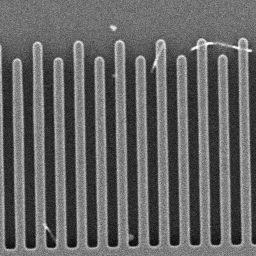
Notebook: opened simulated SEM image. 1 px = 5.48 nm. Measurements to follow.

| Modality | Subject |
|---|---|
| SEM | groups of lines, slits or small figures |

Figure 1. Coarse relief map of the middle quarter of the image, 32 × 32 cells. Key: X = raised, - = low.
---XX---XX---XX---XX---XX---XX--
---XX---XX---XX---XX---XX---XX--
---XX---XX---XX---XX---XX---XXX-
---XX---XX---XX---XX---XX---XXX-
---XX---XX---XX---XX---XX---XXX-
---XX---XX---XX---XX---XX---XXX-
---XX---XX---XX---XX---XX---XXX-
---XX---XX---XX---XX---XX---XXX-
---XX---XX---XX---XX---XX---XXX-
---XX---XX---XX---XX---XXX--XXX-
---XX---XX---XX---XX---XXX--XXX-
---XX---XX---XX---XX---XXX---XX-
---XX---XX---XX---XX---XXX---XX-
---XX---XX---XX---XX---XXX---XX-
---XX---XX---XX---XXX---XX---XX-
---XX---XX---XX---XXX---XX---XX-
---XX---XX---XXX--XXX---XX---XX-
---XX---XX---XXX--XXX---XX---XX-
---XX---XX---XXX--XXX---XX---XX-
---XX---XX---XXX--XXX---XX---XX-
---XX---XX---XXX--XXX---XX---XX-
---XX---XX---XXX--XXX---XX---XX-
---XX---XX---XXX--XXX---XX---XX-
---XX---XX---XXX---XX---XX---XX-
---XX---XX---XXX---XX---XX---XX-
---XX---XX---XXX---XX---XX---XX-
---XX---XX---XXX---XX---XX---XX-
---XX---XX---XXX---XX---XX---XX-
---XX---XX---XXX---XX---XX---XX-
---XX---XX----XX---XX---XX---XX-
---XX---XX----XX---XX---XX---XX-
---XX---XX----XX---XX---XX---XX-